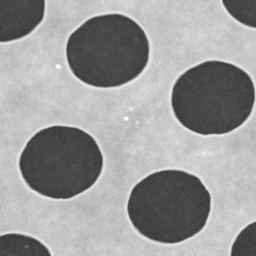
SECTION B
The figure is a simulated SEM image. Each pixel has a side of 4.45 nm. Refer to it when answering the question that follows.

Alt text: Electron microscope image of holes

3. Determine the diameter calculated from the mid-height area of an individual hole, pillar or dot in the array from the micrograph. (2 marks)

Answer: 347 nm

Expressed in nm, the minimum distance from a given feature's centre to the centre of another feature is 516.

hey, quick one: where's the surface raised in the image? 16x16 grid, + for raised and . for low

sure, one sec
...+++++++++++..
..+++....++++++.
.+++.....+++++++
++++.....+++++++
+++++....+++...+
+++++++++++.....
+++++++++++.....
+++++++++++....+
++....++++++++++
+.....++++++++++
+.....++++++++++
++....+++....+++
++++++++.....+++
++++++++.....+++
+++++++++...+++.
...++++++++++++.